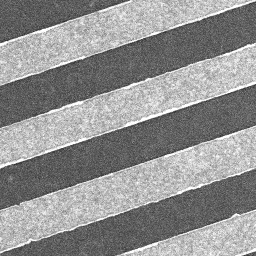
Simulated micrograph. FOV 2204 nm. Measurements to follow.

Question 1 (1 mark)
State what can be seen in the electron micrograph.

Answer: one or a few lines or trenches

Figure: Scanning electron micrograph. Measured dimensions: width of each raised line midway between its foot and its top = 342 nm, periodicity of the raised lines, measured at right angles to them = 0.683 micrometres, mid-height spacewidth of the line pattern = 348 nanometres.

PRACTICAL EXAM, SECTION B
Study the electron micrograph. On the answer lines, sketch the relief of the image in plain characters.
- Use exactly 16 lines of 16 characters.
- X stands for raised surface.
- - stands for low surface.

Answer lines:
-------XXXXXXXX-
----XXXXXXXX----
-XXXXXXXX-------
XXXXXX--------XX
XXX--------XXXXX
--------XXXXXXX-
----XXXXXXXX----
--XXXXXXX-------
XXXXXX--------XX
XXX--------XXXXX
--------XXXXXXXX
-----XXXXXXXX---
--XXXXXXXX------
XXXXXXX--------X
XXXX--------XXXX
X--------XXXXXXX